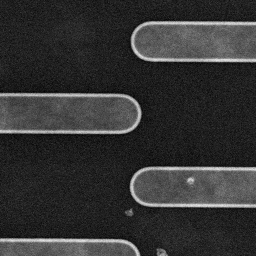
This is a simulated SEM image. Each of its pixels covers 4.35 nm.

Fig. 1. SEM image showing groups of lines, slits or small figures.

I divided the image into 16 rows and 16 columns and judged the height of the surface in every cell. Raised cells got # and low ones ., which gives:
................
.........#######
........########
.........#######
................
................
#########.......
#########.......
................
................
................
........########
.........#######
................
................
########........